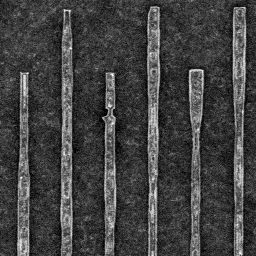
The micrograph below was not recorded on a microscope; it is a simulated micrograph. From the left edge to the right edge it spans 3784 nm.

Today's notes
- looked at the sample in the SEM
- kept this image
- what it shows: parallel lines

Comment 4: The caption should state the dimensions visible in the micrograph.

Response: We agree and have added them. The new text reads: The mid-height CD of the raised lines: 142 nanometres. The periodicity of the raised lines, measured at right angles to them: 636 nm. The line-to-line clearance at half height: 504 nm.